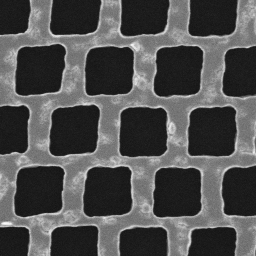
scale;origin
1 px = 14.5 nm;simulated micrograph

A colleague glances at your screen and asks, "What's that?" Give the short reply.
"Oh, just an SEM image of a regular array of holes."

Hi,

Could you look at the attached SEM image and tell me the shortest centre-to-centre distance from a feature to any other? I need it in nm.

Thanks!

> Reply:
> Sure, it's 1000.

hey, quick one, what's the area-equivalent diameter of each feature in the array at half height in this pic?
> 777 nanometers